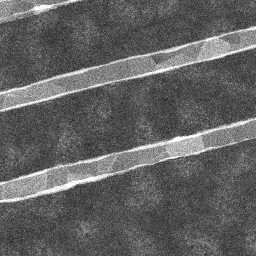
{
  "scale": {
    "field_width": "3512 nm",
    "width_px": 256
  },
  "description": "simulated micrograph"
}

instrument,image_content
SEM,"one or a few lines or trenches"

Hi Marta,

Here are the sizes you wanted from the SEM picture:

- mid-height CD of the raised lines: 244 nanometres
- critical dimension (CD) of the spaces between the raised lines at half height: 973 nm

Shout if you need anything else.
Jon